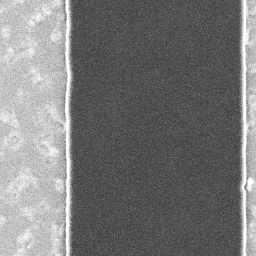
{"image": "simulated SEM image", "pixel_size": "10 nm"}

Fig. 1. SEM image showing one or a few lines or trenches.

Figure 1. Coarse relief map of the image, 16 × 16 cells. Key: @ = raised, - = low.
----@@@@@@@@@@@-
----@@@@@@@@@@@-
----@@@@@@@@@@@-
----@@@@@@@@@@@-
----@@@@@@@@@@@-
----@@@@@@@@@@@-
----@@@@@@@@@@@-
----@@@@@@@@@@@-
----@@@@@@@@@@@-
----@@@@@@@@@@@-
----@@@@@@@@@@@-
----@@@@@@@@@@@-
----@@@@@@@@@@@-
----@@@@@@@@@@@-
----@@@@@@@@@@@-
----@@@@@@@@@@@-